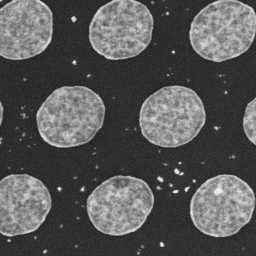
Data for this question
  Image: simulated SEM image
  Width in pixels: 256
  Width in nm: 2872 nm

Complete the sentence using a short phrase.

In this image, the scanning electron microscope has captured raised bodies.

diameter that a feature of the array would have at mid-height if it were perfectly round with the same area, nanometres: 702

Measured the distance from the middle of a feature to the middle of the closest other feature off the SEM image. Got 1140 nm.